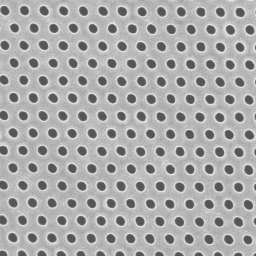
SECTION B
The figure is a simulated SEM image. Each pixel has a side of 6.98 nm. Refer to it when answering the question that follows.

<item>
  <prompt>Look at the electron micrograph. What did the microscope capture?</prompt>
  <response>a regular array of holes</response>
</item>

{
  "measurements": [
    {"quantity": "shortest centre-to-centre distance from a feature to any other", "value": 135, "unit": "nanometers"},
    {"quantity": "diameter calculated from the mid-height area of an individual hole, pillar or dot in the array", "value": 63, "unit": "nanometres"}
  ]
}